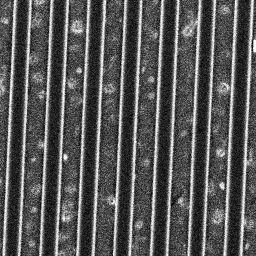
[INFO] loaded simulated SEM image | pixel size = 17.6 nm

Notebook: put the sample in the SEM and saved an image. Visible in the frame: parallel lines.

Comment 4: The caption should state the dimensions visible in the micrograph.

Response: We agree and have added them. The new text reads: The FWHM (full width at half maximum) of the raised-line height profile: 0.282 micrometres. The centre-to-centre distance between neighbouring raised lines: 650 nm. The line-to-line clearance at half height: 361 nanometers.